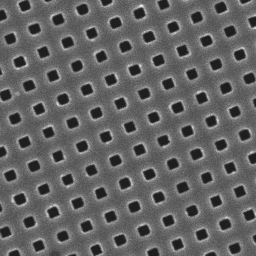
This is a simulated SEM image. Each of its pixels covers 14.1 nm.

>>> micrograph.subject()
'a regular array of holes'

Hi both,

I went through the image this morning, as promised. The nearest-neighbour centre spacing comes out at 25.2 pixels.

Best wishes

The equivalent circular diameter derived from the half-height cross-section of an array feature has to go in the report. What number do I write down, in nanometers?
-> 164